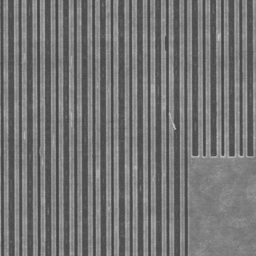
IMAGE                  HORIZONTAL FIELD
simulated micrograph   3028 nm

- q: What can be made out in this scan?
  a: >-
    parallel lines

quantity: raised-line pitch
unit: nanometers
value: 109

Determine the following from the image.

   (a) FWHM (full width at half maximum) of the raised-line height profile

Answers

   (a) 0.0532 micrometres